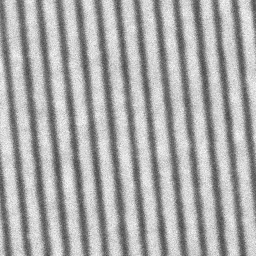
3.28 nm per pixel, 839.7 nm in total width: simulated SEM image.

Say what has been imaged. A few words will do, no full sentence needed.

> parallel lines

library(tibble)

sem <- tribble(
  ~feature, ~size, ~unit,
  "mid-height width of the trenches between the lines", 29.7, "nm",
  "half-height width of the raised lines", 33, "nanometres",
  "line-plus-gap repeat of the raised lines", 63.8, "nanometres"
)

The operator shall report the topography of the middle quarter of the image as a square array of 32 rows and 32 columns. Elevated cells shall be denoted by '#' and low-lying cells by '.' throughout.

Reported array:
..##...##..###..###..###..###..#
..##...##...##..###..###..###..#
..##...##...##..###..###..###..#
..###..##...##...##..###..###..#
..###..##...##...##...##...##..#
..###..###..##...##...##...##..#
...##..###..##...###..##...##...
..###..###..###..###..##...##...
...##...##..###..###..###..##...
...##...##..###..###..###..##...
...##...##...##..###..###..###..
#..##...##...##..###...##..###..
#..###..##...##...##...##..###..
#..###..##...##...##...##...##..
#..###..###..###..##...##...##..
#..###..###..###..###..##...##..
#..###..###..###..###..###..##..
#..###...##..###..###..###..###.
#...##...##..###..###..###..###.
#...##...##...##..###..###..###.
#...##...##...##..###...##..###.
##..###..##...##...##...##..###.
##..###..##...##...##...##...##.
##..###..###..##...##...##...##.
##..###..###..##...##...##...##.
##..###..###..###..###..##...##.
##...##...##..###..###..###..###
##...##...##..###..###..###..###
##...##...##...##..###..###..###
###..##...##...##..###...##..###
###..##...##...##...##..###..###
###..###..##...##...##..###...##